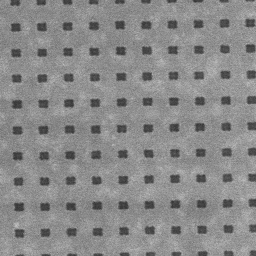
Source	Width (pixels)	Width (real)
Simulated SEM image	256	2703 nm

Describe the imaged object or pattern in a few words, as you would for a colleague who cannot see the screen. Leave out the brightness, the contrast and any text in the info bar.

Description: a regular array of holes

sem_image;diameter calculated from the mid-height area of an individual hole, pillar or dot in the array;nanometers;108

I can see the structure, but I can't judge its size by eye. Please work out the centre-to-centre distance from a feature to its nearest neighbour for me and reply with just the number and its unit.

25.4 pixels